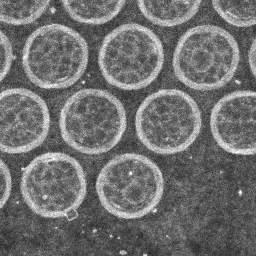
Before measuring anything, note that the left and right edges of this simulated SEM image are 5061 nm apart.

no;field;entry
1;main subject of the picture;raised bodies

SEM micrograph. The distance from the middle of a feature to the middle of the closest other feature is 1470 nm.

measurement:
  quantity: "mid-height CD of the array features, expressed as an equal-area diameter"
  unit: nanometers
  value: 1180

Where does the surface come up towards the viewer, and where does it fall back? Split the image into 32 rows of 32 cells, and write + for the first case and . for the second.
++++++..+++++++...++++++...+++++
+++++....+++++....++++++....++++
.++........+.......++++......+++
......+.........+...............
....+++++.....+++++....+++++....
+...++++++...+++++++...++++++...
+..++++++++..+++++++..+++++++...
+..++++++++..+++++++..+++++++...
+..+++++++...+++++++..+++++++...
....++++++...++++++....+++++....
.....+++.......+++......+++.....
................................
+++++....+++++.....+++++....++++
+++++...+++++++...++++++...+++++
++++++..+++++++..++++++++..+++++
++++++..+++++++..++++++++..+++++
++++++..+++++++...++++++...+++++
+++++....+++++....++++++...+++++
.++.......+++......+++.......+++
......+.........................
....+++++.....+++++.............
+..+++++++...+++++++............
+..+++++++...+++++++............
+..+++++++...+++++++............
+..+++++++...+++++++............
....+++++....++++++.............
.....+++.......+++..............
................................
................................
................................
................................
................................